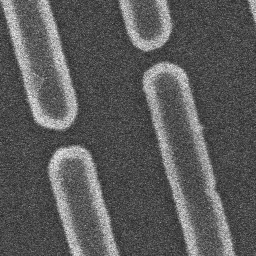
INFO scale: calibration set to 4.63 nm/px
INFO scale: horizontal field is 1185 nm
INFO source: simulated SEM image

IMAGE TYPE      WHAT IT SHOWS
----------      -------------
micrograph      one or a few lines or trenches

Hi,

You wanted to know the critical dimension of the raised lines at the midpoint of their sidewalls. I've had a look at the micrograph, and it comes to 172 nanometers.